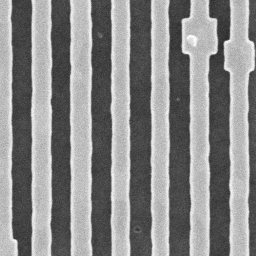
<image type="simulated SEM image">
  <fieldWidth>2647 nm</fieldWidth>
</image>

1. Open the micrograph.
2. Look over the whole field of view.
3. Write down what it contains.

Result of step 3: wiring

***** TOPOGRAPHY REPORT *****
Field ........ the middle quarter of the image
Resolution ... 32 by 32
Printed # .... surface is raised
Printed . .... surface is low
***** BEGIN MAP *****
..#####.....####......####......
..#####.....####......####......
..#####.....####......####......
..#####.....####......####......
..#####.....####......####......
..#####.....####......####......
..#####.....####......####......
..#####.....####......####......
..#####.....####......####......
..#####.....####......####......
..#####.....####......####......
..#####.....####......####......
..#####.....####......####......
..#####.....####......####......
..#####.....####......####......
..#####.....####......####......
..#####.....####......####......
..#####.....####......####......
..#####.....####......####......
..#####.....####......####......
..#####.....####......####......
..#####.....####......####......
..#####.....####......####......
..#####.....####......####......
..#####.....####......####......
..#####.....####......####......
..#####.....####......####......
..#####.....####......####......
..#####.....####......####......
..#####.....####......####......
..#####.....####......####......
..#####.....####......####......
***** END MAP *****